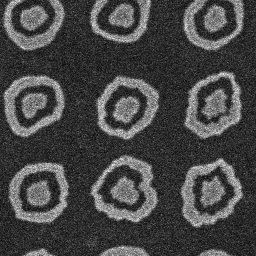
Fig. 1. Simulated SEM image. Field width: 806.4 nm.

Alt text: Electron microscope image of ring-shaped raised bodies with a dot in the middle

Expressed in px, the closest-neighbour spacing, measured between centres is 85.2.